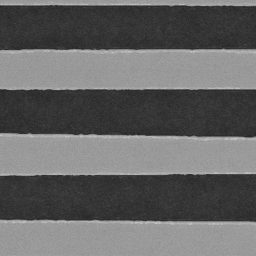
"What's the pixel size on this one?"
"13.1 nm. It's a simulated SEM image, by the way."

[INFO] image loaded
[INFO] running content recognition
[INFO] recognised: lines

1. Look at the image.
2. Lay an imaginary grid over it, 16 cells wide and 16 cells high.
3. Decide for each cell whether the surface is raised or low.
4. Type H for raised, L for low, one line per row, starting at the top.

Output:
LLLLLLLLLLLLLLLL
LLLLLLLLLLLLLLLL
LLLLLLLLLLLLLLLL
HHHHHHHHHHHHHHHH
HHHHHHHHHHHHHHHH
HHHHHHHHHHHHHHHH
LLLLLLLLLLLLLLLL
LLLLLLLLLLLLLLLL
HHHHHHHHHLLLLLLL
HHHHHHHHHHHHHHHH
HHHHHHHHHHHHHHHH
LLLLLLLLLLLLLLLL
LLLLLLLLLLLLLLLL
LLLLLLLLLLLLLLLL
HHHHHHHHHHHHHHHH
HHHHHHHHHHHHHHHH